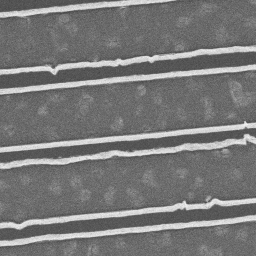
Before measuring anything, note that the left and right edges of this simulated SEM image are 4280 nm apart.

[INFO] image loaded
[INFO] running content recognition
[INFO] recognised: one or a few lines or trenches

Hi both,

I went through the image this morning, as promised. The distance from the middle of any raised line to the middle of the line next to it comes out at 1.26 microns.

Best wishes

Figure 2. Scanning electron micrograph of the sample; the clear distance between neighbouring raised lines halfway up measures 58 pixels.